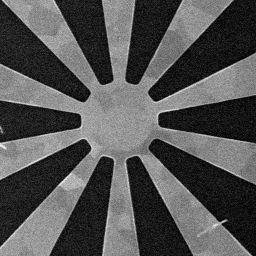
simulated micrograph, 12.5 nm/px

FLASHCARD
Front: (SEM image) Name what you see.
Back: groups of lines, slits or small figures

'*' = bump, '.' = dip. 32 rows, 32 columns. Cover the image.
.******......****......******...
..******.....****.....******....
...*****.....****.....*****.....
....*****....***.....*****......
.....****....***.....****.......
......****....**....****........
.......***....**....***.........
........***...**...***........**
*........**...**..***.......****
***.......**..**..**......******
*****......*****.**.....********
*******....********...**********
**********.********.********....
......*****************.........
..........**********............
..........**********............
........***************.........
..********.********.*********...
********...********...**********
******.....********.....********
****......**..**..**.......*****
**.......***..**...**........***
........***...**...***.........*
.......***....**....***.........
......****....**....****........
.....****.....**.....****.......
....*****.....***....*****......
...*****.....****.....*****.....
..******.....****.....******....
.******......****......******...
*******......****......*******..
******.......****.......*******.